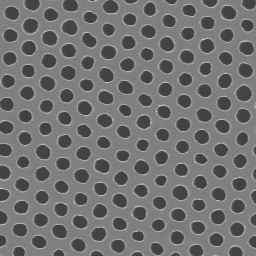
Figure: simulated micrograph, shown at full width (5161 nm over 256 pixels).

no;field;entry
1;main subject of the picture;a regular array of holes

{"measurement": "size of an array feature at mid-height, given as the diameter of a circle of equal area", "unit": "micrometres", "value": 0.268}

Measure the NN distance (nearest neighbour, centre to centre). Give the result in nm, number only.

447